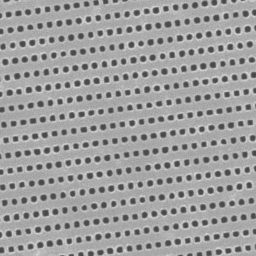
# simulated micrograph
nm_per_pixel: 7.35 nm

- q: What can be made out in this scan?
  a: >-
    a regular array of holes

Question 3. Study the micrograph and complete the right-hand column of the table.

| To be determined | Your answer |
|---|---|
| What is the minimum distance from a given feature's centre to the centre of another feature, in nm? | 70.8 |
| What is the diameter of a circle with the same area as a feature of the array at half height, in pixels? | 6.67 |